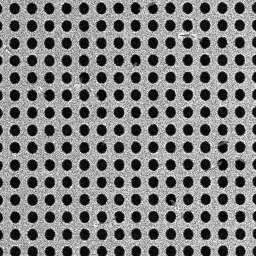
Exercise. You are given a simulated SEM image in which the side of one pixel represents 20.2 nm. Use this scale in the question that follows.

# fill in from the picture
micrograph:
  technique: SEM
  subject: a regular array of holes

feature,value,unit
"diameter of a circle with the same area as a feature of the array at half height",227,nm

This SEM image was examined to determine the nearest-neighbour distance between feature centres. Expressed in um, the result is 0.346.